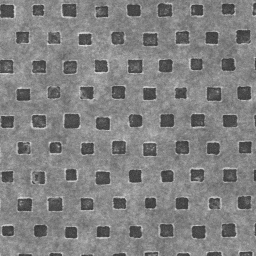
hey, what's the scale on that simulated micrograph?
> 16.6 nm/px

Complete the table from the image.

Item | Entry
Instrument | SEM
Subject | a regular array of holes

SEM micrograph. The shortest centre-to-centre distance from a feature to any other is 510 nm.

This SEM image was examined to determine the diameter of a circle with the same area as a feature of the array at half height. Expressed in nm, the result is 247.